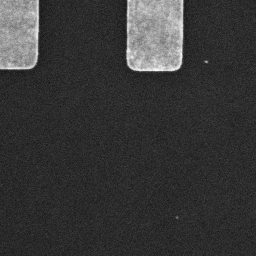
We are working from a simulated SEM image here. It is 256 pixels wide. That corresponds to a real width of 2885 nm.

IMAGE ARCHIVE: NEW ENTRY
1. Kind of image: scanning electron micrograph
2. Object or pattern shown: wiring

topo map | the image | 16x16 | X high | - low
XX------XXX-----
XX------XXX-----
XX------XXX-----
XX------XXX-----
----------------
----------------
----------------
----------------
----------------
----------------
----------------
----------------
----------------
----------------
----------------
----------------